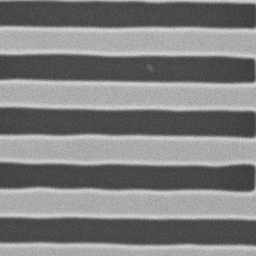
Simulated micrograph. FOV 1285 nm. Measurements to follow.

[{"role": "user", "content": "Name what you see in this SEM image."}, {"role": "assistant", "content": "groups of lines, slits or small figures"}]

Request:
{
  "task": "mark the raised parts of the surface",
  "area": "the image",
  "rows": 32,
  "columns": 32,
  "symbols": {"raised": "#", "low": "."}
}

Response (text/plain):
................................
................................
................................
###########......####.###.......
################################
################################
################################
................................
................................
................................
###########################..###
################################
################################
......##########################
................................
................................
................................
################################
################################
################################
.........####...##############.#
................................
................................
................................
################################
################################
################################
................................
................................
................................
...####.........................
################################